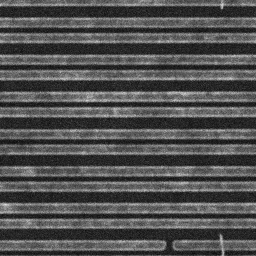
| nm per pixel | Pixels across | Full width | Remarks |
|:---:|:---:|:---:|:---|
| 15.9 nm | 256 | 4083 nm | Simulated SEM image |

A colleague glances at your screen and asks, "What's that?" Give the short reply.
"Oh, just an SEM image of parallel lines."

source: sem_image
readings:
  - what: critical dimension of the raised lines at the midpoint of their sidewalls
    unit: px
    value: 7.5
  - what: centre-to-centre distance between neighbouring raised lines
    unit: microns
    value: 0.296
